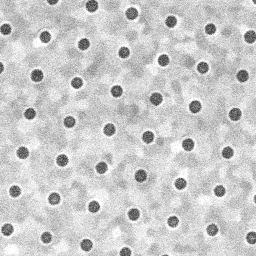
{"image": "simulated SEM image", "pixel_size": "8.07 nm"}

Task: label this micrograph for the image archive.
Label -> a regular array of holes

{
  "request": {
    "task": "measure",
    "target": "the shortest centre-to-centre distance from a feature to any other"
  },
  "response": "316 nanometers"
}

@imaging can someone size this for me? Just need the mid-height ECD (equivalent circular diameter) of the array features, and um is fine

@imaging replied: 0.108